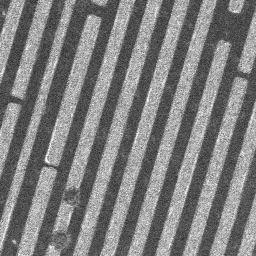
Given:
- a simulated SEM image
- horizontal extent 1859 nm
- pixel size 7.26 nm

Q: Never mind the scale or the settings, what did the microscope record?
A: parallel lines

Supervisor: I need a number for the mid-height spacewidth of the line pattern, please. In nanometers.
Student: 91.4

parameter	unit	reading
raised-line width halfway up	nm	98.4